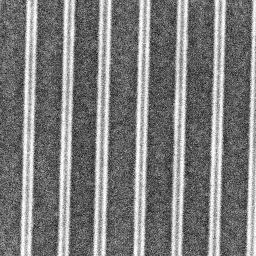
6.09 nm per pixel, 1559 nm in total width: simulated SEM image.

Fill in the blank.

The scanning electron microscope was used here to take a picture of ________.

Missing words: parallel lines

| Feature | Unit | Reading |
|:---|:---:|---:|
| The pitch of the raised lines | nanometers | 229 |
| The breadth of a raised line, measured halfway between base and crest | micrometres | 0.0457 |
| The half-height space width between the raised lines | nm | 184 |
